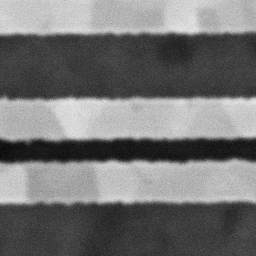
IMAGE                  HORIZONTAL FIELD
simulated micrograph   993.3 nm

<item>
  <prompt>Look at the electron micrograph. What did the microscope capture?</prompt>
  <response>lines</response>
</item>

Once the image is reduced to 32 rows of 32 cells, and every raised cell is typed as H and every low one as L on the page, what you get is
HHHHHHHHHHHHHHHHHHHHHHHHHHHHHHHH
HHHHHHHHHHHHHHHHHHHHHHHHHHHHHHHH
HHHHHHHHHHHHHHHHHHHHHHHHHHHHHHHH
HHHHHHHHHHHHHHHHHHHHHHHHHHHHHHHH
LLLLLLLLLLLLLLLLLLLLLLLLLLLLLLLL
LLLLLLLLLLLLLLLLLLLLLLLLLLLLLLLL
LLLLLLLLLLLLLLLLLLLLLLLLLLLLLLLL
LLLLLLLLLLLLLLLLLLLLLLLLLLLLLLLL
LLLLLLLLLLLLLLLLLLLLLLLLLLLLLLLL
LLLLLLLLLLLLLLLLLLLLLLLLLLLLLLLL
LLLLLLLLLLLLLLLLLLLLLLLLLLLLLLLL
LLLLLLLLLLLLLLLLLLLLLLLLLLLLLLLL
LLLLHLLHHHHHLHLLHHHHHHHHHHHHHHHH
HHHHHHHHHHHHHHHHHHHHHHHHHHHHHHHH
HHHHHHHHHHHHHHHHHHHHHHHHHHHHHHHH
HHHHHHHHHHHHHHHHHHHHHHHHHHHHHHHH
HHHHHHHHHHHHHHHHHHHHHHHHHHHHHHHH
LHLLLLLLLLLLLLLLLLLLLLLLLLLLLLLL
LLLLLLLLLLLLLLLLLLLLLLLLLLLLLLLL
LLLLLLLLLLLLLLLLLLLLLLLLLLLLLLLL
HLLHHHHHHHHHHHHHHHHHHHHHHHHHHHHH
HHHHHHHHHHHHHHHHHHHHHHHHHHHHHHHH
HHHHHHHHHHHHHHHHHHHHHHHHHHHHHHHH
HHHHHHHHHHHHHHHHHHHHHHHHHHHHHHHH
HHHHHHHHHHHHHHHHHHHHHHHHHHHHHHHH
LLLLLLLLLLLLLLLLLLLLLLLLLLLLLLLL
LLLLLLLLLLLLLLLLLLLLLLLLLLLLLLLL
LLLLLLLLLLLLLLLLLLLLLLLLLLLLLLLL
LLLLLLLLLLLLLLLLLLLLLLLLLLLLLLLL
LLLLLLLLLLLLLLLLLLLLLLLLLLLLLLLL
LLLLLLLLLLLLLLLLLLLLLLLLLLLLLLLL
LLLLLLLLLLLLLLLLLLLLLLLLLLLLLLLL